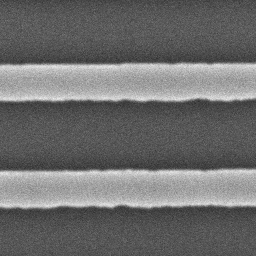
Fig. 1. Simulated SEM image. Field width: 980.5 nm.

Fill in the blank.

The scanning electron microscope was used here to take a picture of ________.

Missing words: lines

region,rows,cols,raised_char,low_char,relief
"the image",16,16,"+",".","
................
................
................
................
++++++++++++++++
++++++++++++++++
................
................
................
................
................
++++++++++++++++
++++++++++++++++
................
................
................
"